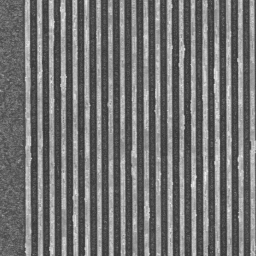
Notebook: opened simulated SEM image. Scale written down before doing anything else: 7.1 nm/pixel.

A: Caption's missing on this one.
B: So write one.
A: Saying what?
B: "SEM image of parallel lines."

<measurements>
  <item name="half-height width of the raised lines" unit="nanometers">30.2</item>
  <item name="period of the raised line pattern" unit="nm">83.8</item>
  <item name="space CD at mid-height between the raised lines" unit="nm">53.2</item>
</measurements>